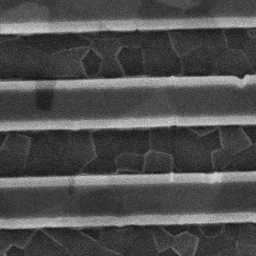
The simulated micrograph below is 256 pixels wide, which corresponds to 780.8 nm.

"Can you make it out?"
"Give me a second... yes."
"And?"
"one or a few lines or trenches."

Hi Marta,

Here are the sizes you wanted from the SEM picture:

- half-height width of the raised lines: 131 nanometres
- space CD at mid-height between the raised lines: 169 nanometres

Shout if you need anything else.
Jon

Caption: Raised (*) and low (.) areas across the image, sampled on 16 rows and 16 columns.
****************
***************.
................
................
................
****************
****************
****************
................
................
................
****************
****************
****************
................
................